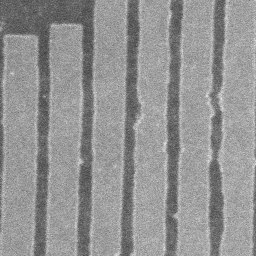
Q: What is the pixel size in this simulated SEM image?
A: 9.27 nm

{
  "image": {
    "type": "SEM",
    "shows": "parallel lines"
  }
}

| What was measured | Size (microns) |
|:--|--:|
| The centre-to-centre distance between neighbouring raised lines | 0.402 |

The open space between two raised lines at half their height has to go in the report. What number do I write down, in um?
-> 0.27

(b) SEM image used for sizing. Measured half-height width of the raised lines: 136 nanometers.